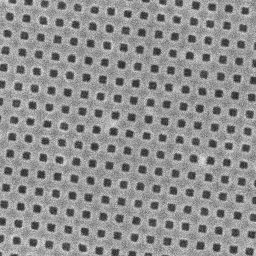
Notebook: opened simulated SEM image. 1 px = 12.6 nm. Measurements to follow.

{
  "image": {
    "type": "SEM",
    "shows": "a regular array of holes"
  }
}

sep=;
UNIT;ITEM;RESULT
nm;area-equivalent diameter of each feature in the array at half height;120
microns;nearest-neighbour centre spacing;0.205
